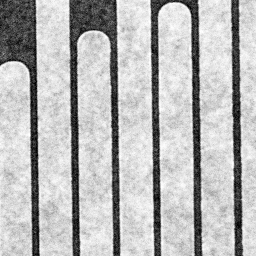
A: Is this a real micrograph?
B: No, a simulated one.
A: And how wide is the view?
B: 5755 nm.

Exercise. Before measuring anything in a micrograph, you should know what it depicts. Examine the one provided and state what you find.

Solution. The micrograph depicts parallel lines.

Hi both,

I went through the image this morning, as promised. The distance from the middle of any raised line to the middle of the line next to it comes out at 912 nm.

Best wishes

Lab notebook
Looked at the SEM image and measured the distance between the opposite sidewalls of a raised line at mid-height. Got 716 nm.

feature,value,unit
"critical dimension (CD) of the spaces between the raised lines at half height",194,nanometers